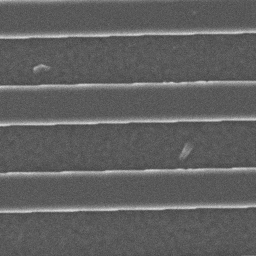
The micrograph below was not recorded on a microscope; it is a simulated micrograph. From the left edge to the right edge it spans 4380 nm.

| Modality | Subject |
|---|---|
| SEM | lines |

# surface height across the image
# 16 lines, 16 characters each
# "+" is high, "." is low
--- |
++++++++++++++++
++++++++++++++++
................
................
................
++++++++++++++++
++++++++++++++++
++++++++++++++..
................
................
................
++++++++++++++++
++++++++++++++++
................
................
................